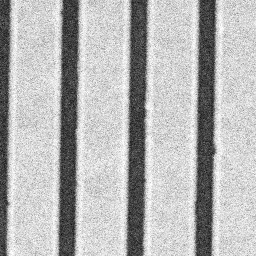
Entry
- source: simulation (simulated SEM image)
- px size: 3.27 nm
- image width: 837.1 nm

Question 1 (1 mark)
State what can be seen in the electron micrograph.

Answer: one or a few lines or trenches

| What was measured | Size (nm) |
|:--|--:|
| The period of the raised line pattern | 224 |